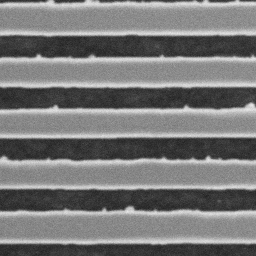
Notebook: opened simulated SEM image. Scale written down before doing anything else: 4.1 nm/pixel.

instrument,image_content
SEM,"lines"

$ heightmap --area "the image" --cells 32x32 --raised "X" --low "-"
XXXXXXX---XXXXXXXXXXXXXXXXXXXXXX
XXXXXXXXXXXXXXXXXXXXXXXXXXXXXXXX
XXXXXXXXXXXXXXXXXXXXXXXXXXXXXXXX
XXXXXXXXXXXXXXXXXXXXXXXXXXXXXXXX
--------------------------------
--------------------------------
--------------------------------
XXXXXXXXXXXXXXXXXXXXXXXXXXXXXXXX
XXXXXXXXXXXXXXXXXXXXXXXXXXXXXXXX
XXXXXXXXXXXXXXXXXXXXXXXXXXXXXXXX
XXXXXXXXXXXXXXXXXXXXXXXXXXXXXXXX
--------------------------------
--------------------------------
--------------------------------
XXXXXXXXXXXXXXXXXXXXXXXXXXXXXXXX
XXXXXXXXXXXXXXXXXXXXXXXXXXXXXXXX
XXXXXXXXXXXXXXXXXXXXXXXXXXXXXXXX
--------------------------------
--------------------------------
--------------------------------
XXXXXXXXXXXXXXXXXXXXXXXXXXXXXXXX
XXXXXXXXXXXXXXXXXXXXXXXXXXXXXXXX
XXXXXXXXXXXXXXXXXXXXXXXXXXXXXXXX
XXXXXXXXXXXXXXXXXXXXXXXXXXXXXXXX
--------------------------------
--------------------------------
--X---XXXXX---XXXX---XXXX------X
XXXXXXXXXXXXXXXXXXXXXXXXXXXXXXXX
XXXXXXXXXXXXXXXXXXXXXXXXXXXXXXXX
XXXXXXXXXXXXXXXXXXXXXXXXXXXXXXXX
--------------------------------
--------------------------------